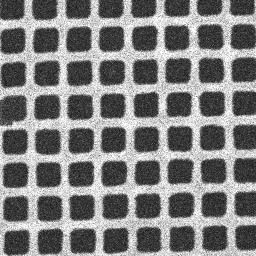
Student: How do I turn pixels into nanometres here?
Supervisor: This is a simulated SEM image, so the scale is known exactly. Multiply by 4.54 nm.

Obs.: a regular array of holes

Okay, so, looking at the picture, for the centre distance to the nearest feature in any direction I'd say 148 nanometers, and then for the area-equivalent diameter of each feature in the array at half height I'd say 125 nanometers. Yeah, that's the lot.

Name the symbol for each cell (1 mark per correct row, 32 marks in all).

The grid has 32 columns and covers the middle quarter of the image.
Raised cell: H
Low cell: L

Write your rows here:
HLLLLLLHHLLLLLLHHLLLLLLLHLLLLLLL
HLLLLLLHHLLLLLLHHLLLLLLLHLLLLLLL
HLLLLLLHHLLLLLLHHLLLLLLHHLLLLLLL
HLLLLLLHHLLLLLLHHLLLLLLHHLLLLLLL
HLLLLLLHHLLLLLLHHHLLLLLHHHLLLLLH
HHLLLLHHHHHHHHHHHHHHHHHHHHHHHHHH
HHHHHHHHHHHHHHHHHHHHHHHHHHHHHHHH
HHHHHHHHHHLLLLLHHHHLLLLLHHLLLLLL
HLLLLLLHHLLLLLLHHHLLLLLLHHLLLLLL
HLLLLLLHHLLLLLLHHLLLLLLLHHLLLLLL
HLLLLLLHHLLLLLLHHLLLLLLLHHLLLLLL
HLLLLLLHHLLLLLLLHLLLLLLLHHLLLLLL
HLLLLLLHHLLLLLLHHLLLLLLLHHLLLLLL
HLLLLLLHHHLLLLHHHHHLLHHHHHHLHHHH
HHHHHHHHHHHHHHHHHHHHHHHHHHHHHHHH
HHHHHHHHHHHHHHHHHHHHHHHHHHHLHLLH
HHLLLLLHHLLLLLLHHHLLLLLLHHLLLLLL
HLLLLLLHHLLLLLLLHLLLLLLLHHLLLLLL
HLLLLLLLHLLLLLLLHLLLLLLLHHLLLLLL
HLLLLLLLHLLLLLLLHLLLLLLLHHLLLLLL
HLLLLLLLHLLLLLLLHLLLLLLLHHLLLLLL
HLLLLLLHHLLLLLLHHHLLLLLHHHLLLLLL
HHHHHHHHHHHHHHHHHHHHHHHHHHHHHHHH
HHHHHHHHHHHHHHHHHHHHHHHHHHHHHHHH
HHHHLLLHHHLLLLLHHHLLLLLLHHLLLLLL
HLLLLLLHHHLLLLLLHHLLLLLLHHLLLLLL
HLLLLLLHHLLLLLLLHHLLLLLLHHLLLLLL
HLLLLLLHHLLLLLLLHHLLLLLLHHLLLLLL
HLLLLLLLHLLLLLLLHHLLLLLLHHLLLLLL
HLLLLLLHHLLLLLLHHHLLLLLLHHLLLLLL
HHLLLLHHHHLLLLHHHHHHHHHHHHHHHHHH
HHHHHHHHHHHHHHHHHHHHHHHHHHHHHHHH